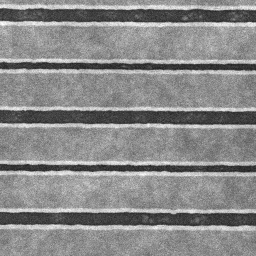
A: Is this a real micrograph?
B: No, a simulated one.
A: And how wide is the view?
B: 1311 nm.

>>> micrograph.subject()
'parallel lines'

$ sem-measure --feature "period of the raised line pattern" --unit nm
255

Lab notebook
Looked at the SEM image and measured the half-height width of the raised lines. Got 38.2 pixels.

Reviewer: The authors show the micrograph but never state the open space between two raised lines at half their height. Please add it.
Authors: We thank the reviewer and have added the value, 78.8 nanometers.